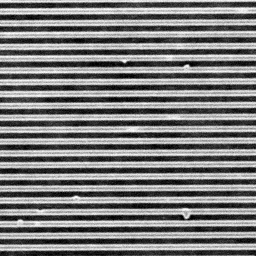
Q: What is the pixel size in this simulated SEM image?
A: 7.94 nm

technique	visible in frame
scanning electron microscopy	parallel lines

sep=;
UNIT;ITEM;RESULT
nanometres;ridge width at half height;37.7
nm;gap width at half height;52.6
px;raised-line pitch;11.8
